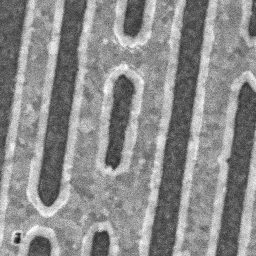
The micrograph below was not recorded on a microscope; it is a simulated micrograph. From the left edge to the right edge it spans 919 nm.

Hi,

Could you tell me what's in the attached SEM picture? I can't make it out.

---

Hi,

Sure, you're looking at one or a few lines or trenches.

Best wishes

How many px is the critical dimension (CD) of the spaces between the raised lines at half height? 31.6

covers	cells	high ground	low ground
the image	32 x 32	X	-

----XXX----XXXX----XXXX----XXXX-
----XXX----XXXX----XXX----XXXXX-
----XXX----XXXX----XXX----XXXXX-
---XXXX----XXXX---XXXX----XXXX--
---XXXX----XXXX---XXXX----XXXXX-
---XXXX---XXXXXXXXXXXX----XXXXXX
---XXXX---XXXXXXXXXXXX----XXXXXX
---XXX----XXXXXXXXXXXX----XXXXXX
---XXX----XXXXXXXXXXXX---XXXXXXX
---XXX----XXXX---XXXX----XXXXXXX
--XXXX----XXXX---XXXX----XXXXX--
--XXXX----XXXX---XXXX----XXXX---
--XXXX----XXX----XXXX----XXXX---
--XXXX---XXXX----XXXX----XXXX---
--XXX----XXXX----XXXX----XXXX---
--XXX----XXXX----XXXX----XXXX---
--XXX----XXXX---XXXX----XXXXX---
--XXX----XXXX---XXXX----XXXX----
-XXXX----XXXX---XXXX----XXXX----
-XXXX----XXXX---XXXX----XXXX----
-XXXX----XXXX---XXXX----XXXX----
-XXX----XXXXXXXXXXXX----XXXX----
-XXX----XXXXXXXXXXX----XXXXX----
-XXX----XXXXXXXXXXX----XXXXX---X
XXXX----XXXXXXXXXXX----XXXXX---X
XXXXX--XXXXXXXXXXXX----XXXX----X
XXXXXXXXXXXXXXXXXXX----XXXX----X
XXXXXXXXXXXXXXXXXXX----XXXX----X
XXXXXXXXXXXX--XXXXX----XXXX----X
XXXX--XXXXX---XXXX----XXXXX---XX
XXX----XXXX---XXXX----XXXXX---XX
XXX----XXXX---XXXX----XXXX----XX